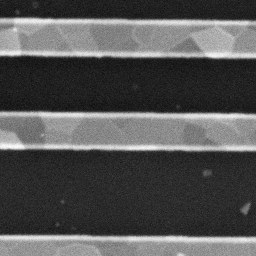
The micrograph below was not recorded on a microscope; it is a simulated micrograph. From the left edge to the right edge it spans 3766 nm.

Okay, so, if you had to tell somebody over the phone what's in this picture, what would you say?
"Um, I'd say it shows lines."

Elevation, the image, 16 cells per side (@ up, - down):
----------------
@@@@@@@@@@@@@@@@
@@@@@@@@@@@@@@@@
--------@@@@@@@@
----------------
----------------
----------------
@@@@@@@@@@@@@@@@
@@@@@@@@@@@@@@@@
----------------
----------------
----------------
----------------
----------------
----------------
@@@@@@@@@@@@@@@@